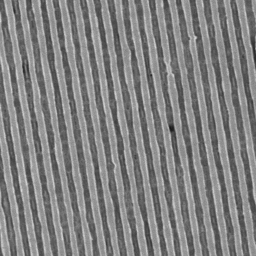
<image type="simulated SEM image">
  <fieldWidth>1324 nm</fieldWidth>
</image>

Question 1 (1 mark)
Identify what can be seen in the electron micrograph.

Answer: parallel lines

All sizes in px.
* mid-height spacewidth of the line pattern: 6.91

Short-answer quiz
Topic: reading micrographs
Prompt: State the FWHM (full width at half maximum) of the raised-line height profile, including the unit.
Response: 6.91 pixels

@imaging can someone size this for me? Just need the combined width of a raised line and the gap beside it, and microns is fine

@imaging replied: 0.0699